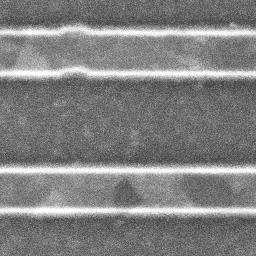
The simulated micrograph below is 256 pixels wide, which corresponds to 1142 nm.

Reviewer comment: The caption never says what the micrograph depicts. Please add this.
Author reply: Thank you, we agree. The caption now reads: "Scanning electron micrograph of one or a few lines or trenches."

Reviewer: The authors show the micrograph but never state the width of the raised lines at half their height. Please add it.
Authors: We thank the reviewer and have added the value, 182 nm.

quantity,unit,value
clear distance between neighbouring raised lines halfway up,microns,0.432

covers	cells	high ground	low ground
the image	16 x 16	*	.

................
................
****************
****************
****..**********
................
................
................
................
................
................
****************
****************
................
................
................